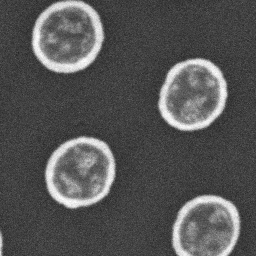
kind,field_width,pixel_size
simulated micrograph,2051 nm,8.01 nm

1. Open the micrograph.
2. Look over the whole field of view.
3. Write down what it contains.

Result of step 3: raised bodies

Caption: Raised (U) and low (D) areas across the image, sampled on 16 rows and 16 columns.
DDDUUDDDDDDDDDDD
DDUUUUDDDDDDDDDD
DDUUUUDDDDDDDDDD
DDDUUUDDDDDDDDDD
DDDDDDDDDDDUUUDD
DDDDDDDDDDUUUUDD
DDDDDDDDDDUUUUDD
DDDDDDDDDDDUUDDD
DDDDDDDDDDDDDDDD
DDDDUUUDDDDDDDDD
DDDUUUUDDDDDDDDD
DDDUUUUDDDDDDDDD
DDDDUUDDDDDDDUDD
DDDDDDDDDDDUUUUD
DDDDDDDDDDDUUUUD
DDDDDDDDDDDUUUDD